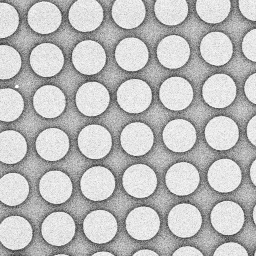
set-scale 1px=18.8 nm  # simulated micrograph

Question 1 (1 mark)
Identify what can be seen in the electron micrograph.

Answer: an array of small figures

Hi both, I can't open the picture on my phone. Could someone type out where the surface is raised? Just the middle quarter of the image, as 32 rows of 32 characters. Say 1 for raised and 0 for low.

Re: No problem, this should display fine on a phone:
00011111110000111111000001111000
00011111100000001100000000000000
00000110000000000000000000000000
00000000000000000000000000011000
00000000000000011111000001111110
00001111110000111111100011111111
00001111111000111111110011111111
00011111111001111111110011111111
00011111111001111111110011111111
00011111111000111111110011111111
00011111111000111111100001111110
00001111110000011111000000010000
00000111100000000000000000000000
00000000000000000000000000000000
00000000000000000000000000011110
00000011100000001111100001111111
00000111111000011111110001111111
00001111111000111111110001111111
10001111111100111111110001111111
10001111111100111111110001111111
10001111111100011111110000111111
10001111111000011111100000011110
00000111111000001111000000000000
00000011100000000000000000000000
00000000000000000000000000000000
00000000000000000111100000011111
00000011111000001111110000111111
00000111111100011111111000111111
10001111111100011111111000111111
11001111111110011111111000111111
11001111111110011111111000111111
11001111111100011111110000011111